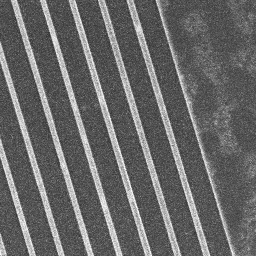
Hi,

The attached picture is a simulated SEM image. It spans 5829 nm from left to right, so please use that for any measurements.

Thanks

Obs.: parallel lines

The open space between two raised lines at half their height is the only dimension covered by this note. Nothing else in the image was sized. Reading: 518 nm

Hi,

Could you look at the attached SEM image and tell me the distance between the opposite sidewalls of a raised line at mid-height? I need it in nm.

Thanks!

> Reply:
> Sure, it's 114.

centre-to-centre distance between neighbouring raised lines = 632 nm